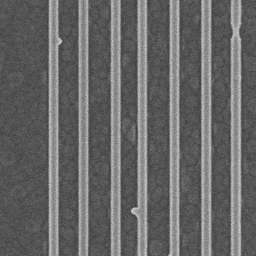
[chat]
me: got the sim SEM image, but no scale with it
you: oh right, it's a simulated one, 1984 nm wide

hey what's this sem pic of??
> parallel lines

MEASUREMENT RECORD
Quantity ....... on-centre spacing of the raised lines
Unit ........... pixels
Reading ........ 30.4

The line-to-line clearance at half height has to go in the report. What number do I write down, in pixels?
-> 23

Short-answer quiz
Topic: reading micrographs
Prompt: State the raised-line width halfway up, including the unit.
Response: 0.0668 microns